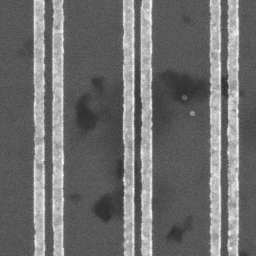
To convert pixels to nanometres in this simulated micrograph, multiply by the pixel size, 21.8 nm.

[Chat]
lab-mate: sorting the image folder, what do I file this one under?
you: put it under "lines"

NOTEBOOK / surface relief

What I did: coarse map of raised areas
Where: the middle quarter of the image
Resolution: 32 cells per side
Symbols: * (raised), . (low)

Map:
...............**...**..........
...............**...**..........
...............**...**..........
...............**...**..........
...............**...**..........
...............**...**..........
...............**...**..........
...............**...**..........
...............**...**..........
...............**...**..........
...............**...**..........
...............**...**..........
...............**...**..........
...............**...**..........
...............**...**..........
...............**...**..........
...............**...**..........
...............**...**..........
...............**...**..........
...............**...**..........
...............**...**..........
...............**...**..........
...............**...**..........
...............**...**..........
...............**...**..........
...............**...**..........
...............**...**..........
...............**...**..........
...............**...**..........
...............**...**..........
...............**...**..........
...............**...**..........